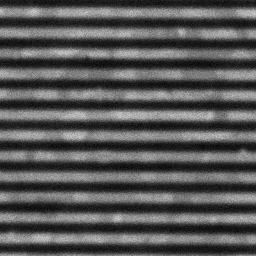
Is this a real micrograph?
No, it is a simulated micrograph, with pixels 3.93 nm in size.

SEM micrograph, parallel lines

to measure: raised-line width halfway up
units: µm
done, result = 0.0349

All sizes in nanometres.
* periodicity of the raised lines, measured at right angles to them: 80.7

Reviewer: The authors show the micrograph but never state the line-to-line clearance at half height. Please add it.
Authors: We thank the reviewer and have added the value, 0.0427 µm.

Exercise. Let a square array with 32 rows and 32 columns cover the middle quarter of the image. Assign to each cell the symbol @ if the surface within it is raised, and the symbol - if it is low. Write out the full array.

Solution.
--------------------------------
@@@@@@@@@@@@@@@@----------------
@@@@@@@@@@@@@@@@@@@@@@@@@@@@@@@@
@@@@@@@@@@@@@@@@@@@@@@@@@@@@@@@@
--------------------------------
--------------------------------
--------@@----------------------
@@@@@@@@@@@@@@@@@@@@@@@@@@@@@@@@
@@@@@@@@@@@@@@@@@@@@@@@@@@@@@@@@
--------------------------------
--------------------------------
--------------------------------
@@@@@@@@@@@@@@@@@@@@@@@@@@@@@@@@
@@@@@@@@@@@@@@@@@@@@@@@@@@@@@@@@
--------------------------------
--------------------------------
--------------------------------
@@@@@@@@@@@@@@@@@@@@@@@@@@@@@@@@
@@@@@@@@@@@@@@@@@@@@@@@@@@@@@@@@
--------------------------------
--------------------------------
--------------------------------
@@@@@@@@@@@@@@@@@@@@@@@@@@@@@@@@
@@@@@@@@@@@@@@@@@@@@@@@@@@@@@@@@
--------------------------------
--------------------------------
--------------------------------
@@@@@@@@@@@@@@@@@@@@@@@@@@@@@@@@
@@@@@@@@@@@@@@@@@@@@@@@@@@@@@@@@
--------------------------------
--------------------------------
--------------------------------